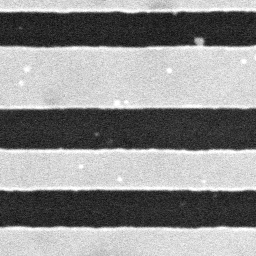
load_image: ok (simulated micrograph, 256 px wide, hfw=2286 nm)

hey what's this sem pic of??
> lines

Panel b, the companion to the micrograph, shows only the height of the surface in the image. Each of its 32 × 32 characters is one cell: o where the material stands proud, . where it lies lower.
oooooooooooooooooooooooooooooooo
.......oo......oooo.............
................................
................................
................................
................................
oooooooooooooooooooooooooooooooo
oooooooooooooooooooooooooooooooo
oooooooooooooooooooooooooooooooo
oooooooooooooooooooooooooooooooo
oooooooooooooooooooooooooooooooo
oooooooooooooooooooooooooooooooo
oooooooooooooooooooooooooooooooo
ooooooo.......o.o.............o.
................................
................................
................................
................................
................................
oooooooooooooooooooooooooooooooo
oooooooooooooooooooooooooooooooo
oooooooooooooooooooooooooooooooo
oooooooooooooooooooooooooooooooo
oooooooooooooooooooooooooooooooo
................................
................................
................................
................................
oooo...o.......o...........oo...
oooooooooooooooooooooooooooooooo
oooooooooooooooooooooooooooooooo
oooooooooooooooooooooooooooooooo